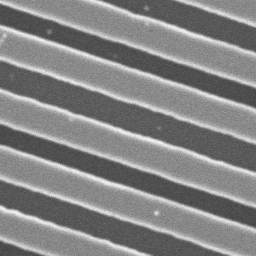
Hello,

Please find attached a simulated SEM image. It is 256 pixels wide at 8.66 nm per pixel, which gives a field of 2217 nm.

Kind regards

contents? lines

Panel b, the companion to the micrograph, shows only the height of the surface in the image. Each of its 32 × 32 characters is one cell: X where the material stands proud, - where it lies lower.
XXXXXXXXXXXXXX----------XXXXXXXX
---XXXXXXXXXXXXX----------XXXXXX
------XXXXXXXXXXXXX----------XXX
X--------XXXXXXXXXXXXX----------
XXXX--------XXXXXXXXXXXXX-------
XXXXXXX---------XXXXXXXXXXXXX---
XXXXXXXXXX---------XXXXXXXXXXXXX
XXXXXXXXXXXXX--------XXXXXXXXXXX
---XXXXXXXXXXXXX---------XXXXXXX
------XXXXXXXXXXXXX---------XXXX
---------XXXXXXXXXXXXXX--------X
X-----------XXXXXXXXXXXXX-------
XXXX-----------XXXXXXXXXXXXX----
XXXXXXX-----------XXXXXXXXXXXXXX
XXXXXXXXXX------------XXXXXXXXXX
XXXXXXXXXXXXX-----------XXXXXXXX
---XXXXXXXXXXXXX------------XXXX
------XXXXXXXXXXXXX-----------XX
X--------XXXXXXXXXXXXX----------
XXXX--------XXXXXXXXXXXXX-------
XXXXXXX---------XXXXXXXXXXXX----
XXXXXXXXXX---------XXXXXXXXXXXXX
XXXXXXXXXXXXX--------XXXXXXXXXXX
---XXXXXXXXXXXXX--------XXXXXXXX
------XXXXXXXXXXXXX---------XXXX
----------XXXXXXXXXXXX---------X
XX----------XXXXXXXXXXXXXX------
XXXXX-----------XXXXXXXXXXXX----
XXXXXXXX-----------XXXXXXXXXXXX-
XXXXXXXXXXX-----------XXXXXXXXXX
--XXXXXXXXXXXX-----------XXXXXXX
-----XXXXXXXXXXXX-----------XXXX